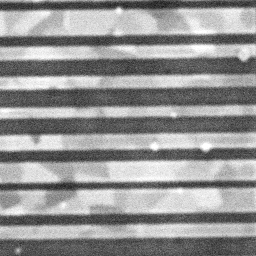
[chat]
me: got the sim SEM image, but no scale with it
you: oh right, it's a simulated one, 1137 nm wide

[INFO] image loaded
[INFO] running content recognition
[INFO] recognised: groups of lines, slits or small figures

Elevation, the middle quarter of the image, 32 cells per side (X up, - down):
--------------------------------
--------------------------------
--------------------------------
XXXXXXXXXXXXXXXXXXXXXXXXXXXXXXXX
XXXXXXXXXXXXXXXXXXXXXXXXXXXXXXXX
XXXXXXXXXXXXXXXXXXXXXXXXXXXXXXXX
--------------------------------
--------------------------------
--------------------------------
--------------------------------
--------------------------------
XXXXXXXXXXXXXXXXXXXXXXXXXXXXXXXX
XXXXXXXXXXXXXXXXXXXXXXXXXXXXXXXX
--------------------------------
--------------------------------
--------------------------------
--------------------------------
--------------------------------
XXXXXXXXXXXXXXXXXXXXXXXXXXXXXXXX
XXXXXXXXXXXXXXXXXXXXXXXXXXXXXXXX
XXXXXXXXXXXXXXXXXXXXXXXXXXXXXXXX
--------------------------------
--------------------------------
--------------------------------
--------------------------XXXXXX
XXXXXXXXXXXXXXXXXXXXXXXXXXXXXXXX
XXXXXXXXXXXXXXXXXXXXXXXXXXXXXXXX
XXXXXXXXXXXXXXXXXXXXXXXXXXXXXXXX
XXXXXXXXXXXXXXXXXXXXXXXXXXXXXXXX
--------------------------------
--------------------------------
---------------------------XXXXX